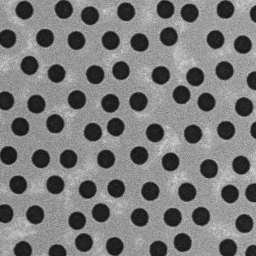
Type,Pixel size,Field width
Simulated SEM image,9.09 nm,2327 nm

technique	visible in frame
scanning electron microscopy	a regular array of holes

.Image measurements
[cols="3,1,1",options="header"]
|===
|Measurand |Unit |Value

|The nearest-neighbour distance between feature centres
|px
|28.1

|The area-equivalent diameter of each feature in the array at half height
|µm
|0.169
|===